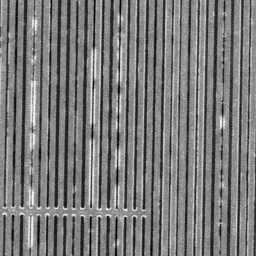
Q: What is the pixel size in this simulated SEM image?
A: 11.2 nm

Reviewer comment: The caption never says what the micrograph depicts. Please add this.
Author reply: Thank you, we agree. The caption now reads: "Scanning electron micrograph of parallel lines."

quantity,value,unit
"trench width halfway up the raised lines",2.75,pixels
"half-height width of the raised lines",0.0617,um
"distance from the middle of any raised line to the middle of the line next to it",97.1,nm